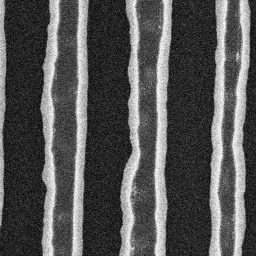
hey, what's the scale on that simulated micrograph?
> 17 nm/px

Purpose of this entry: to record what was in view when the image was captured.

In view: one or a few lines or trenches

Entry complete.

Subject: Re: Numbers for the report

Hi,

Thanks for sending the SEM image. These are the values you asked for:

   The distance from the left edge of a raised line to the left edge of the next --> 1400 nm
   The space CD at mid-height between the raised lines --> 880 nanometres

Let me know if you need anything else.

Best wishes